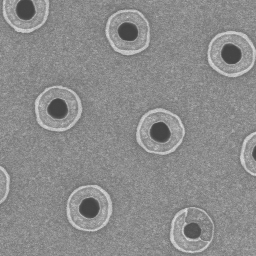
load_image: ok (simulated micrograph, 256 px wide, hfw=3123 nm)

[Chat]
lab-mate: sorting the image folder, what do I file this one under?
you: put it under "ring-shaped raised bodies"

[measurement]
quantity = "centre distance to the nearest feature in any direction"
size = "1280 nm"